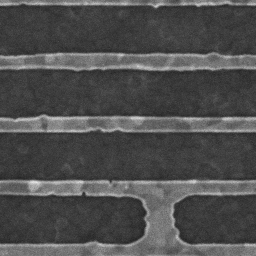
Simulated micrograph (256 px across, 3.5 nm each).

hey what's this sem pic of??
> one or a few lines or trenches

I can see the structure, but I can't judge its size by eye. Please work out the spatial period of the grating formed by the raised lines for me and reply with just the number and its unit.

0.222 µm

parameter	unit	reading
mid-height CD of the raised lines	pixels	13.3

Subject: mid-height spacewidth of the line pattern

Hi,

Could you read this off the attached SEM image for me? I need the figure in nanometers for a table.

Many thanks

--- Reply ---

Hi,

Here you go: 176